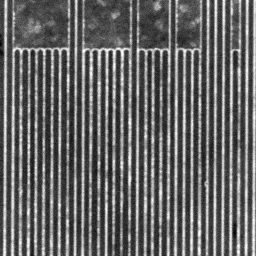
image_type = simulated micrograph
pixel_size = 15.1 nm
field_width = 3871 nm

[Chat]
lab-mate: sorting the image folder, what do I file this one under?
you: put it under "parallel lines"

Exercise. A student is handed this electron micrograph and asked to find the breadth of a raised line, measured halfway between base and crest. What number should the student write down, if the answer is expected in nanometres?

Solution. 30.2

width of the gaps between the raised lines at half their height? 90.7 nanometres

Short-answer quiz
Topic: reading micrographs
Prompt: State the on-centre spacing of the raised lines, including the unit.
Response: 118 nm